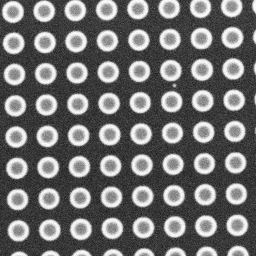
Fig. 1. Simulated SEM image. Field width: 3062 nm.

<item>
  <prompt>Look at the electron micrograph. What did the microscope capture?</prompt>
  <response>an array of small figures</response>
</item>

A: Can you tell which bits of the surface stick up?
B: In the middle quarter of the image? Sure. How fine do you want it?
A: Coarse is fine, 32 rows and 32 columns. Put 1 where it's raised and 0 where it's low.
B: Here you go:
01111000011110000111100011111000
01111100011111001111100011111000
01111100011110001111100011111000
01111000011110000111100001110000
00110000000000000000000000000000
00000000000000000000000000000000
00000000000000000000000000000000
00000000001100000011000001111000
01111000011110000111100001111000
01111100011111000111100001111000
01111100011111000111100001111000
01111000011110000111100001110000
00000000000000000000000000000000
00000000000000000000000000000000
00000000000000000000000000000000
00010000001110000011100001111000
01111100011111000111110001111000
01111100011111000111110001111100
01111100011111000111110001111000
00111100001110000011100000110000
00000000000000000000000000000000
00000000000000000000000000000000
00000000000000000000000000000000
00011000001110000011100001111000
00111100011111000111110001111100
01111100011111000111110001111100
01111100011111000111110001111000
00111100001110000011100000010000
00000000000000000000000000000000
00000000000000000000000000000000
00000000000000000000000000000000
00011100001111000011110001111100